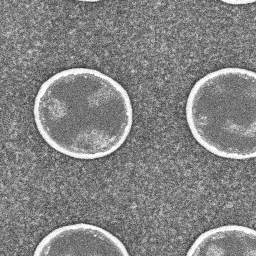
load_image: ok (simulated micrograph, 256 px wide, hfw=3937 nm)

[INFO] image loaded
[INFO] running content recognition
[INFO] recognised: raised bodies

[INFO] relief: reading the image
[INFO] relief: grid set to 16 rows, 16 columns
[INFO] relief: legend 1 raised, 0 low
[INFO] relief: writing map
0000000000000000
0000000000000000
0000000000000000
0000000000000000
0000110000000010
0001111000001111
0011111100001111
0011111100001111
0001111100001111
0000111000000011
0000000000000000
0000000000000000
0000000000000000
0000000000000000
0000111000000111
0011111100001111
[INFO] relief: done